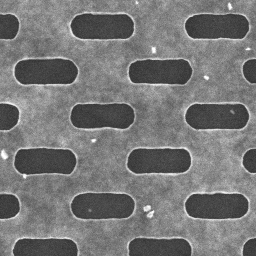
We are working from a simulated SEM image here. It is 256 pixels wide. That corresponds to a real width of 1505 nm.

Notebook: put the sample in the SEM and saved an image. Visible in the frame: a regular array of holes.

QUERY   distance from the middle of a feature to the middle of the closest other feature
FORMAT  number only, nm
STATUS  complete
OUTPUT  425